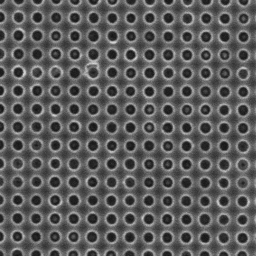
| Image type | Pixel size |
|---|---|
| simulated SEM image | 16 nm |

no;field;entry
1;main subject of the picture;a regular array of holes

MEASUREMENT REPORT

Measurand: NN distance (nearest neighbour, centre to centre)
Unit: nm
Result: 290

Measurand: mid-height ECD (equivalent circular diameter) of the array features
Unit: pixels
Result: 10.7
